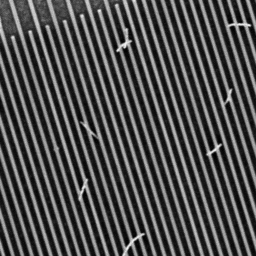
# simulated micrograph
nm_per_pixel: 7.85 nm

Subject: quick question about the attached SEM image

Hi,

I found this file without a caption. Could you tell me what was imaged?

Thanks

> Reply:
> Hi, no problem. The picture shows parallel lines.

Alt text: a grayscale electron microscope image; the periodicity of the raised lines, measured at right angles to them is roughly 71.1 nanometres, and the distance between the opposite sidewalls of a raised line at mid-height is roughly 21.6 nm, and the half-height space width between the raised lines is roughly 43.1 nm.